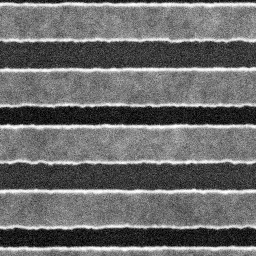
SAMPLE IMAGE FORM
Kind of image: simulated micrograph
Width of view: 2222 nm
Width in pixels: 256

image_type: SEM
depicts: lines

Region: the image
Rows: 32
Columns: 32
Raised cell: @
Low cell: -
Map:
@@-@---@@@@@@@-@@@@@@@-@@@@@@@@@
@@@@@@@@@@@@@@@@@@@@@@@@@@@@@@@@
@@@@@@@@@@@@@@@@@@@@@@@@@@@@@@@@
@@@@@@@@@@@@@@@@@@@@@@@@@@@@@@@@
@@@@@@@@@@@@@@@@@@@@@@@@@@@@@@@@
--------------------------------
--------------------------------
--------------------------------
--------------------------------
@@@@@@@@@@@@@@@@@@@@@@@@@@@@@@@@
@@@@@@@@@@@@@@@@@@@@@@@@@@@@@@@@
@@@@@@@@@@@@@@@@@@@@@@@@@@@@@@@@
@@@@@@@@@@@@@@@@@@@@@@@@@@@@@@@@
--------------------------------
--------------------------------
--------------------------------
@@@@@@@@@@@@@@@@@@@@@@@@@@@@@@@@
@@@@@@@@@@@@@@@@@@@@@@@@@@@@@@@@
@@@@@@@@@@@@@@@@@@@@@@@@@@@@@@@@
@@@@@@@@@@@@@@@@@@@@@@@@@@@@@@@@
---------@----------------------
--------------------------------
--------------------------------
--------------------------------
@@@@@@@@@@@@@@@@@@@@@@@@@@@@@@@@
@@@@@@@@@@@@@@@@@@@@@@@@@@@@@@@@
@@@@@@@@@@@@@@@@@@@@@@@@@@@@@@@@
@@@@@@@@@@@@@@@@@@@@@@@@@@@@@@@@
@--@@-@-@-------------@----@----
--------------------------------
--------------------------------
@@@@@@@@@@@@@@@@@@@@@@@@@@@@@@@@